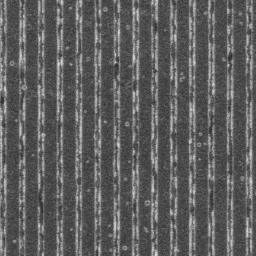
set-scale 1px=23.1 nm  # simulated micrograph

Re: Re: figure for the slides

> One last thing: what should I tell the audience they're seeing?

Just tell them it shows parallel lines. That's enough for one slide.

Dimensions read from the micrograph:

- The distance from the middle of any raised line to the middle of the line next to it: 437 nm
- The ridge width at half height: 133 nanometres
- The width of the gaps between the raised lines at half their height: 309 nanometres